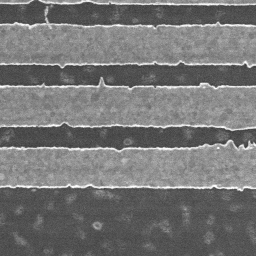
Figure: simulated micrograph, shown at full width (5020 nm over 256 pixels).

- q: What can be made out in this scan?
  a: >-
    one or a few lines or trenches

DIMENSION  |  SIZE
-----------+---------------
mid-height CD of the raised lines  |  0.779 µm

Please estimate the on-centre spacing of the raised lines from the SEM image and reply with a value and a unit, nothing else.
1200 nm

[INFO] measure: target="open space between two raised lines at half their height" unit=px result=21.6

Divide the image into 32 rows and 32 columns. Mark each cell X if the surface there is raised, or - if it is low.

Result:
-----------------X---XXXXXXXXXXX
--------------------------------
--------------------------------
XXXXXXXXXXXXXXXXXXXXXXXXXXXXXXXX
XXXXXXXXXXXXXXXXXXXXXXXXXXXXXXXX
XXXXXXXXXXXXXXXXXXXXXXXXXXXXXXXX
XXXXXXXXXXXXXXXXXXXXXXXXXXXXXXXX
XXXXXXXXXXXXXXXXXXXXXXXXXXXXXXXX
--------------------------------
--------------------------------
------------X------------X------
XXXXXXXXXXXXXXXXXXXXXXXXXXXXXXXX
XXXXXXXXXXXXXXXXXXXXXXXXXXXXXXXX
XXXXXXXXXXXXXXXXXXXXXXXXXXXXXXXX
XXXXXXXXXXXXXXXXXXXXXXXXXXXXXXXX
XXXXXXXXXXXXXXXXXXXXXXXXXXXXXXXX
--------------------------------
--------------------------------
-X---XXX----X-----------XXXXXXXX
XXXXXXXXXXXXXXXXXXXXXXXXXXXXXXXX
XXXXXXXXXXXXXXXXXXXXXXXXXXXXXXXX
XXXXXXXXXXXXXXXXXXXXXXXXXXXXXXXX
XXXXXXXXXXXXXXXXXXXXXXXXXXXXXXXX
------------------------XX-XXXXX
--------------------------------
--------------------------------
--------------------------------
--------------------------------
--------------------------------
--------------------------------
--------------------------------
--------------------------------